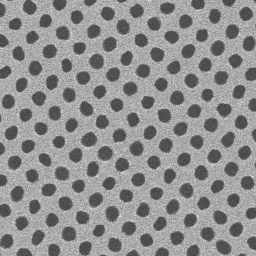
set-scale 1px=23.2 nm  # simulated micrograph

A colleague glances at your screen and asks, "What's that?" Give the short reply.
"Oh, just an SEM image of a regular array of holes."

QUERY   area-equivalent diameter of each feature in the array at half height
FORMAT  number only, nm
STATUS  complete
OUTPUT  316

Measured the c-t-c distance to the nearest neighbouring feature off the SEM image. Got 485 nm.